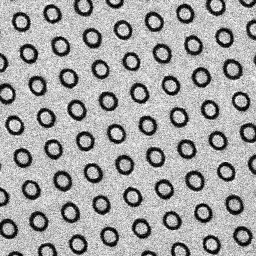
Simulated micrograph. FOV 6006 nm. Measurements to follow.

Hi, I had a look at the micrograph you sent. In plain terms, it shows a regular array of ring-shaped grooves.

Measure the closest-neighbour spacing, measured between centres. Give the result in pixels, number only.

32